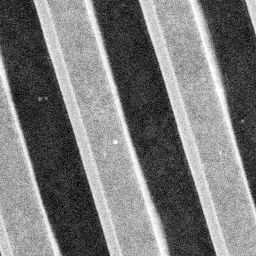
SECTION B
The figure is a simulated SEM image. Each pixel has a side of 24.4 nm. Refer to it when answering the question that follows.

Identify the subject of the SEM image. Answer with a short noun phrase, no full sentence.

lines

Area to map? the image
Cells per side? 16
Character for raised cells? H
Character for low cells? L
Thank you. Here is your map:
LLHHHLLLLHHHLLLH
LLLHHHLLLHHHLLLL
LLLHHHLLLLHHHLLL
LLLHHHLLLLHHHLLL
LLLHHHHLLLHHHLLL
LLLLHHHLLLHHHHLL
HLLLHHHLLLLHHHLL
HLLLHHHHLLLHHHLL
HLLLLHHHLLLHHHLL
HHLLLHHHLLLLHHHL
HHLLLHHHLLLLHHHL
HHLLLLHHHLLLHHHL
HHLLLLHHHLLLLHHH
HHHLLLHHHLLLLHHH
HHHLLLHHHHLLLHHH
HHHLLLLHHHLLLHHH